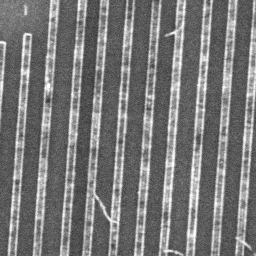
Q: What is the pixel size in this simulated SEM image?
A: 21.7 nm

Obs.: parallel lines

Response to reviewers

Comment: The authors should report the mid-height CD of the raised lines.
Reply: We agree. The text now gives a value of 143 nm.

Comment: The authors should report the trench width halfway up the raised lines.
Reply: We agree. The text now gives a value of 389 nm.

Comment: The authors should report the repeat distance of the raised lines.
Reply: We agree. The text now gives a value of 0.547 micrometres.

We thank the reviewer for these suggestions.